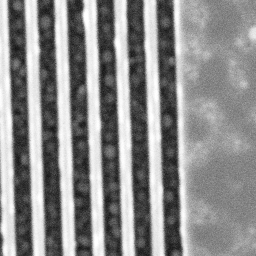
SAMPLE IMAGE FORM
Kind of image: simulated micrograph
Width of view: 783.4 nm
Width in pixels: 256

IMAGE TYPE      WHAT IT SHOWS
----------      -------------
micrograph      parallel lines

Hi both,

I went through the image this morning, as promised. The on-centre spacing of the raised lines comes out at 91.1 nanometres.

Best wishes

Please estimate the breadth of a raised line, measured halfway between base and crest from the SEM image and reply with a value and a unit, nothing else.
33.7 nm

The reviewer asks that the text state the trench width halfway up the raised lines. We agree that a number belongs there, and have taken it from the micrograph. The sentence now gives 0.057 micrometres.